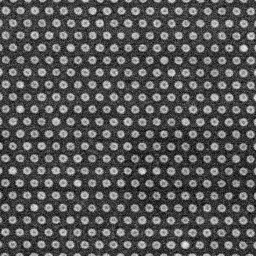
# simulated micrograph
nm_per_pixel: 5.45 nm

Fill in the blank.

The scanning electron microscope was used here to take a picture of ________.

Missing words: a regular array of raised bodies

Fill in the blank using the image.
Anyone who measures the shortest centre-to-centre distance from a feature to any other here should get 76.5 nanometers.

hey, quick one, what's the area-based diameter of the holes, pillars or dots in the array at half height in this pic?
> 7.23 pixels